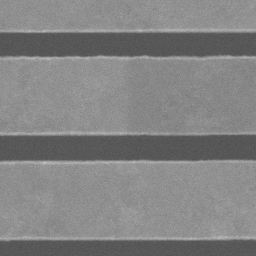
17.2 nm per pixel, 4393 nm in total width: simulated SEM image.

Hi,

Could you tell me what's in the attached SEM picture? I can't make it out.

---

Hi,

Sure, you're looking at lines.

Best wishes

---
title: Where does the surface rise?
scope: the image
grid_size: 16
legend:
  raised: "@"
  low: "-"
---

@@@@@@@@@@@@@@@@
@@@@@@@@@@@@@@@@
----------------
----------------
@@@@@@@@@@@@@@@@
@@@@@@@@@@@@@@@@
@@@@@@@@@@@@@@@@
@@@@@@@@@@@@@@@@
----------------
----------------
@@@@@@@@@@@@@@@@
@@@@@@@@@@@@@@@@
@@@@@@@@@@@@@@@@
@@@@@@@@@@@@@@@@
@@@@@@@@@@@@@@@@
----------------